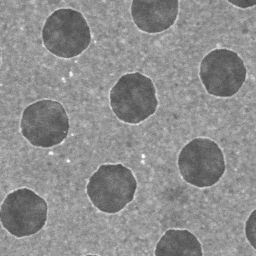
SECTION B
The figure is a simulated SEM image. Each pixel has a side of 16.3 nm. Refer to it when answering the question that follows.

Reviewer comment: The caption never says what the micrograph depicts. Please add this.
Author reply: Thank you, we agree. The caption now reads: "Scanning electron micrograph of holes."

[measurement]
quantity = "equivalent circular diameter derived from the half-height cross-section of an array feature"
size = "796 nanometers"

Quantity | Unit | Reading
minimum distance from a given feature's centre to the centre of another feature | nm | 1510